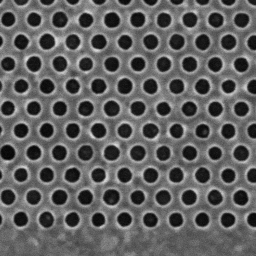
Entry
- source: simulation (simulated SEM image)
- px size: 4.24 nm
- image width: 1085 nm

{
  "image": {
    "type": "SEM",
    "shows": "a regular array of holes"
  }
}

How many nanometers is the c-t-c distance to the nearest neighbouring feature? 108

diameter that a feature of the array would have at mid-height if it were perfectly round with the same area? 65.8 nanometers